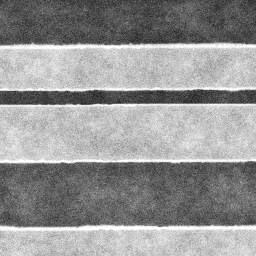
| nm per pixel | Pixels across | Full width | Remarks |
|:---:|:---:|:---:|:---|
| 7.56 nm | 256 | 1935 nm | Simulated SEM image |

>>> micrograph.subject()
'lines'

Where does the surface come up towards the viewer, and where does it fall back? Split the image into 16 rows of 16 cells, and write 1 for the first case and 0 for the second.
0000000000000000
0000000000000000
0000000000000000
1111111111111111
1111111111111111
1111111111111111
1111111111111111
1111111111111111
1111111111111111
1111111111111111
0000000000000000
0000000000000000
0000000000000000
0000000000000000
1111111111111111
1111111111111111